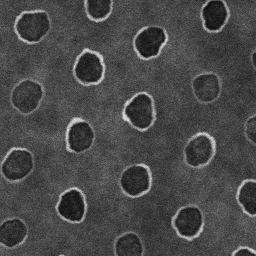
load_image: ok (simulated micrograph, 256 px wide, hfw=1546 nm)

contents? a regular array of holes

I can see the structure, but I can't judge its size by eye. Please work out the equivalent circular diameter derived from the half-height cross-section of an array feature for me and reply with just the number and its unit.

172 nm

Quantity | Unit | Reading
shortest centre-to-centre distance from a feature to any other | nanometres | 405